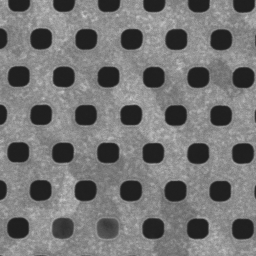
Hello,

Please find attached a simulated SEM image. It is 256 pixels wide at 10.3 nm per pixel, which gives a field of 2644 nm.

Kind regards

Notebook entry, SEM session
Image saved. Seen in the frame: a regular array of holes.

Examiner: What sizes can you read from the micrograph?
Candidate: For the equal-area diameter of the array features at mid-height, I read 232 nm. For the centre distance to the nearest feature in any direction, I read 0.452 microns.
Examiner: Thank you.